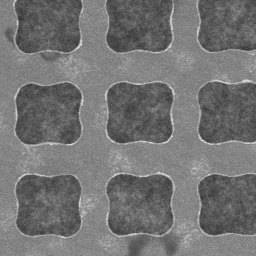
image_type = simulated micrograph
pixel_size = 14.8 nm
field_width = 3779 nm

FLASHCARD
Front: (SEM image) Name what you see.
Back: holes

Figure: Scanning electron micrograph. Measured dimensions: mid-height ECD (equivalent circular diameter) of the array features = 1020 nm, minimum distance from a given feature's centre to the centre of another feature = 1.35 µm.